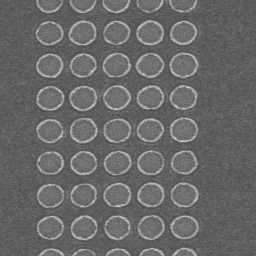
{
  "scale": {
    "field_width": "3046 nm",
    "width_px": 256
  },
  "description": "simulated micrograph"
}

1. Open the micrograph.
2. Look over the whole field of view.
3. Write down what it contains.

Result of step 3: a regular array of holes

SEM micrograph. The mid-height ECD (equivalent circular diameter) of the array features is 288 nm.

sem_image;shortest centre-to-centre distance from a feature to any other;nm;384